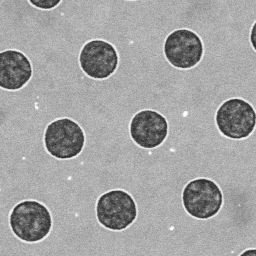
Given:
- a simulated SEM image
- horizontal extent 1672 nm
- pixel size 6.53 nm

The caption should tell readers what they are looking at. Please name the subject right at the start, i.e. holes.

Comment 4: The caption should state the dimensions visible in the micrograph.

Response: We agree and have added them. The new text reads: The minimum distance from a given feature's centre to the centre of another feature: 85.4 pixels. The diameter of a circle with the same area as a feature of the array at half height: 0.264 um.